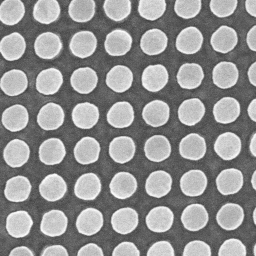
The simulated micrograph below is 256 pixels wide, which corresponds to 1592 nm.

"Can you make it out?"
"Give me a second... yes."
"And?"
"a regular array of raised bodies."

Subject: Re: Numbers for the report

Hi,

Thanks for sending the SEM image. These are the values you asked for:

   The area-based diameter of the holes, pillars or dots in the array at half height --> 163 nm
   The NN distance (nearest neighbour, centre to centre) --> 35.1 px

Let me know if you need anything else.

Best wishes